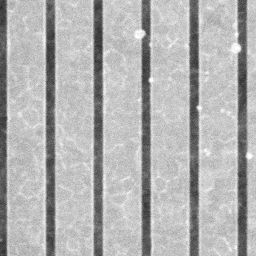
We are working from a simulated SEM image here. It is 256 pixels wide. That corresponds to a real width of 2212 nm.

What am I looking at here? parallel lines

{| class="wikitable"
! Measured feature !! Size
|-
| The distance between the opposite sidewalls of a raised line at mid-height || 322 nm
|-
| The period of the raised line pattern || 415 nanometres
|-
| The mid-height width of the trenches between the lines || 94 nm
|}